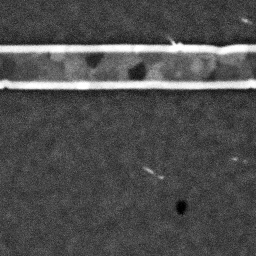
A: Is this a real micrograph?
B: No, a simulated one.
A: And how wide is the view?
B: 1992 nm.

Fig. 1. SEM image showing one or a few lines or trenches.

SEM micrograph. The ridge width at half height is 288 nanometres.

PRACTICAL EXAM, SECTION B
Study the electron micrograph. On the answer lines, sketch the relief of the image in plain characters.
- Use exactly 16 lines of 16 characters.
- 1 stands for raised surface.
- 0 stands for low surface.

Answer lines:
0000000000000000
0000000000000000
0000000000000000
1111111111111111
1111111111111111
0000000000000000
0000000000000000
0000000000000000
0000000000000000
0000000000000000
0000000000000000
0000000000000000
0000000000000000
0000000000000000
0000000000000000
0000000000000000